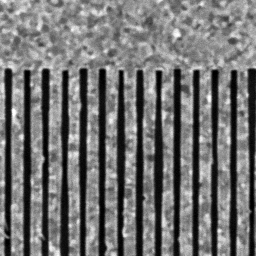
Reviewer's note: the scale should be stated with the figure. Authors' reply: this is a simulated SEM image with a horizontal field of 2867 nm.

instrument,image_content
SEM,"parallel lines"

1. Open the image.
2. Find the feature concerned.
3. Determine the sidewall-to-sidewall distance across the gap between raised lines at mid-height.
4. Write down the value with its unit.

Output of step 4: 84 nm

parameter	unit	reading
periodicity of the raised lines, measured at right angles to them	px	18.8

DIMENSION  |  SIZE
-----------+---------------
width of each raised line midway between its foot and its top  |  126 nm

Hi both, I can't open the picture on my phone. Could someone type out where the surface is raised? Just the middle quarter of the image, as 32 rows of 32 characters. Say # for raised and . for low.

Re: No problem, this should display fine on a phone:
################################
.###..###.####.###..###.###..###
.###..###..##..###..###..##..###
.###..##...##..###..###..##..###
.###..##...##..###..###..##..###
.###..##...##..###..###..##..###
.###..##...##..###..###.###..###
.###..##...##..###..###.###..###
.###..##...##..###..###.###..###
.###..##...##..###..###..##..###
.###..##...##...##..###..##..###
.###..##...##...##..###..##..###
.###..##...##...##..###..##..###
.###..##...##...##..###..##..###
.###..##...##...##..##...##..###
.###..##...##...##..##...##..###
.###..##...##...##..##...##..###
.##...##...##...##..##...##..###
.##...##...##...##..##...##..###
.##...##...##...##..##...##..###
.##...##...##..###..##...##..###
.##...##...##..###..##...##..###
.##...##...##...##..##...##..###
.##...##...##..###..##...##..###
.##...##...##..###..##...##..###
.##...##...##..###..##...##..###
.##...##...##..###..##...##..###
.##...##...##..###..##...##..###
.##...##...##..###..##...##..###
.###..##...##..###..##...##..###
.###..##...##..###..##...##..###
.###..##...##..###..##...##..###